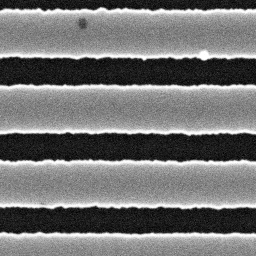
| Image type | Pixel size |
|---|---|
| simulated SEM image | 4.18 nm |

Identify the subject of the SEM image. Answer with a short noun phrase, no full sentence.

lines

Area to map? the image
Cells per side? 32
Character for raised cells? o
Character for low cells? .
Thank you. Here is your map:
................................
oooooooooooooooooooooooooooooooo
oooooooooooooooooooooooooooooooo
oooooooooooooooooooooooooooooooo
oooooooooooooooooooooooooooooooo
oooooooooooooooooooooooooooooooo
oooooooooooooooooooooooooooooooo
................................
................................
................................
................................
oooooooooooooooooooooooooooooooo
oooooooooooooooooooooooooooooooo
oooooooooooooooooooooooooooooooo
oooooooooooooooooooooooooooooooo
oooooooooooooooooooooooooooooooo
oooooooo.oooo.oooooooooooooooooo
................................
................................
................................
oooooooooooooooooooooooooooooooo
oooooooooooooooooooooooooooooooo
oooooooooooooooooooooooooooooooo
oooooooooooooooooooooooooooooooo
oooooooooooooooooooooooooooooooo
oooooooooooooooooooooooooooooooo
................................
................................
................................
oooooooooooooooooooooooooooooooo
oooooooooooooooooooooooooooooooo
oooooooooooooooooooooooooooooooo